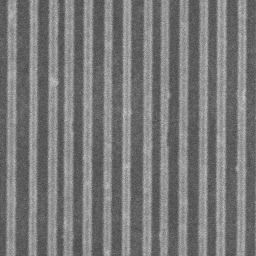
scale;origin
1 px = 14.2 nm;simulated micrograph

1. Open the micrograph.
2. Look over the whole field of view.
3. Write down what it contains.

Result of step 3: parallel lines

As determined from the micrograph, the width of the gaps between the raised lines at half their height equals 12.4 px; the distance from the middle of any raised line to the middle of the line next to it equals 271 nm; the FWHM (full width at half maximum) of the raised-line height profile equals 103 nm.